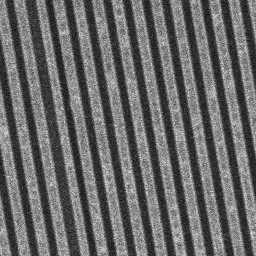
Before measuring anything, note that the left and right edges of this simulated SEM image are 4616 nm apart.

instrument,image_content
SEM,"parallel lines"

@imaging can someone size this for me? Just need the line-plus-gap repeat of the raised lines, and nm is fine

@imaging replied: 346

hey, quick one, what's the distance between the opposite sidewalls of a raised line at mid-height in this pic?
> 182 nm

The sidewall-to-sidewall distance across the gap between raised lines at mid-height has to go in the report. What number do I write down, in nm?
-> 164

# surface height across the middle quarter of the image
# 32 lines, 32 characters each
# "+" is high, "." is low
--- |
+++..+++..++...++...++...++...++
+++..+++..+++..+++..++...++...++
+++..+++..+++..+++..+++..++...++
.++..+++...++..+++..+++..+++..++
.++...++...++...++..+++..+++..++
.+++..++...++...++...++...++..++
.+++..+++..+++..++...++...++..++
.+++..+++..+++..+++..++...++...+
.+++..+++..+++..+++..+++..++...+
.+++...++...++..+++..+++..+++..+
..++...++...++...++...++..+++..+
..+++..+++..++...++...++...++..+
..+++..+++..+++..++...++...++...
..+++..+++..+++..+++..++...++...
+..++..+++..+++..+++..+++..+++..
+..++...++...++...++..+++..+++..
+..+++..++...++...++...++..+++..
+..+++..+++..++...++...++...++..
+..+++..+++..+++..++...++...++..
+..+++..+++..+++..+++..+++..++..
++..++..+++...++..+++..+++..+++.
++..++...++...++...++..+++..+++.
++..+++..++...++...++...++...++.
++..+++..+++..+++..++...++...++.
++..+++..+++..+++..+++..++...++.
++..+++..+++..+++..+++..+++..++.
.++..++..+++...++..+++..+++..+++
.++..++...++...++...++...++..+++
.++..+++..+++..++...++...++...++
.++..+++..+++..+++..++...++...++
.++..+++..+++..+++..+++..++...++
..++.+++..+++..+++..+++..+++..++